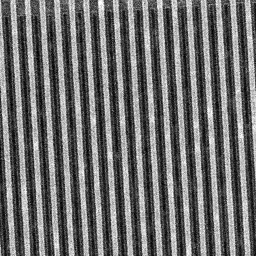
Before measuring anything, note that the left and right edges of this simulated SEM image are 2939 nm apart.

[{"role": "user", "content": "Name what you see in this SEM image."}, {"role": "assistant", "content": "parallel lines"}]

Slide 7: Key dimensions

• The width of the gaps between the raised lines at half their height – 31.5 nanometers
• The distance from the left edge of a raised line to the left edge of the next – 84.1 nm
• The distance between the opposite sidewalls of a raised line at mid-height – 53 nanometres